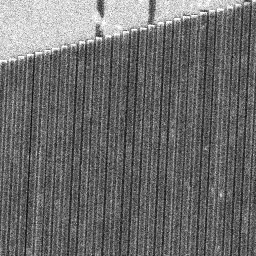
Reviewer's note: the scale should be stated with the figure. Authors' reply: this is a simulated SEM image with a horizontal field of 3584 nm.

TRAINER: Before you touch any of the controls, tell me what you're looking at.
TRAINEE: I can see parallel lines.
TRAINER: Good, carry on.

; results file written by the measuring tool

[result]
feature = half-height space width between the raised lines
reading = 35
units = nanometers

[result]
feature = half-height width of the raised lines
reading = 82.2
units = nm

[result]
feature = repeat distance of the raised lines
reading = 120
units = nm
